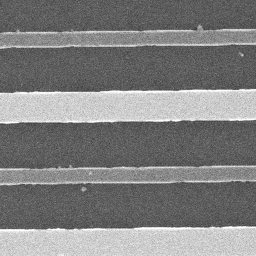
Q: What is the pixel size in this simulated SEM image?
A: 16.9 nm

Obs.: lines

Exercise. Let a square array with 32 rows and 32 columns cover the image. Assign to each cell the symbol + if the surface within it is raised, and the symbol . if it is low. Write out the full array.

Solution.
................................
................................
................................
................................
++++++++++++++++++++++++++++++++
+++++++++++++++++++++++++++.....
................................
................................
................................
................................
................................
.............+++++++++++++++++++
++++++++++++++++++++++++++++++++
++++++++++++++++++++++++++++++++
++++++++++++++++++++++++++++++++
................................
................................
................................
................................
................................
................................
++++++++++++++++++++++++++++++++
++++++++++++++++++++++++++++++++
................................
................................
................................
................................
................................
............................++++
++++++++++++++++++++++++++++++++
++++++++++++++++++++++++++++++++
++++++++++++++++++++++++++++++++